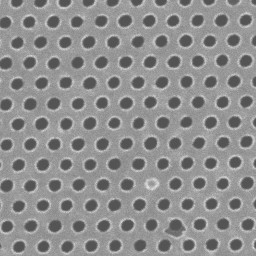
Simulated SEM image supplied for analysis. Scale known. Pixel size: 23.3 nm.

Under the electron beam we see a regular array of holes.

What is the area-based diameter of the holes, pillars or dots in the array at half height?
0.297 microns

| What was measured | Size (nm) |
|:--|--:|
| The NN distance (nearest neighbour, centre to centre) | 544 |